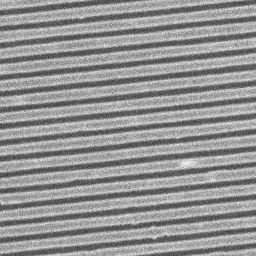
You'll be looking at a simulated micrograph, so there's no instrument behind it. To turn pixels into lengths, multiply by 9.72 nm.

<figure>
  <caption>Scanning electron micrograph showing parallel lines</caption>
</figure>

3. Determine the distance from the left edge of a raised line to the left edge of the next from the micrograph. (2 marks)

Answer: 157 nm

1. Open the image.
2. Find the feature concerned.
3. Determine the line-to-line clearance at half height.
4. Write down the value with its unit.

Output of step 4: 65.2 nm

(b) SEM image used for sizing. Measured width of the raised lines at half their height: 94.2 nanometers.